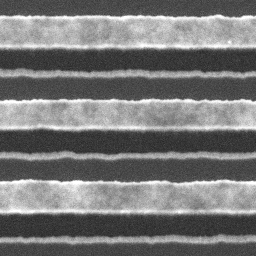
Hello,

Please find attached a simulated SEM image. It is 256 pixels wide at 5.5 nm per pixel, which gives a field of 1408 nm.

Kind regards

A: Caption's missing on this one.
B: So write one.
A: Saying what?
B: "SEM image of lines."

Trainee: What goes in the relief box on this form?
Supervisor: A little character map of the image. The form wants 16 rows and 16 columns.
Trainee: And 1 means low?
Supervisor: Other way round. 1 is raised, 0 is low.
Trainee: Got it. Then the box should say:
1111111111111111
1111111111111111
1111111111111111
0000000000000000
0000000000000000
1111111111111111
1111111111111111
1111111111111111
0000000000000000
0000000000000000
1111111111111111
1111111111111111
1111111111111111
0000000000000000
0000000000000000
1111111111111111